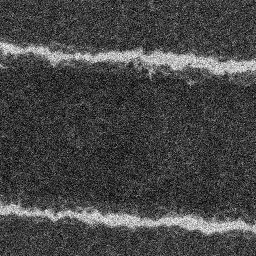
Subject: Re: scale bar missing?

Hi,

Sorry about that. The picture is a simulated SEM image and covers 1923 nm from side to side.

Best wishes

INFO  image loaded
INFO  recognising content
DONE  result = one or a few lines or trenches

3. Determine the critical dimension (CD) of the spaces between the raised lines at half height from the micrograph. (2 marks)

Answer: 1210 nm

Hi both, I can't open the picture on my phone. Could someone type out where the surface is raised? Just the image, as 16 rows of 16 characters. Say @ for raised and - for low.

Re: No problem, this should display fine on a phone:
@@@@@@@@@@@@@@@@
@@@@@@@@@@@@@@@@
@@@@@@@@@@@@@@@@
---@@@@@-@@@@@@@
----------------
----------------
----------------
----------------
----------------
----------------
----------------
----------------
----------------
@@@-@-----------
@@@@@@@@@@@@@@@@
@@@@@@@@@@@@@@@@